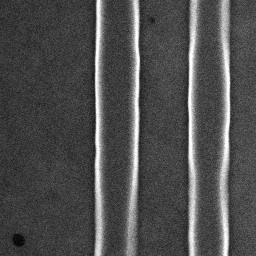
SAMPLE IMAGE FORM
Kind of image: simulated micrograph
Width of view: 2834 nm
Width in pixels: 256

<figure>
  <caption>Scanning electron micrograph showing wiring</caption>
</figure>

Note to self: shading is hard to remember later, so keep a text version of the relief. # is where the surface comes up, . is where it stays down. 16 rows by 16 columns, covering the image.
......###...##..
......###...##..
......###...##..
......###...##..
......###...##..
......###...##..
......###...##..
......###...##..
......###...##..
......###...##..
......###...##..
......##....##..
......##....##..
......##....##..
......##....##..
......##....##..